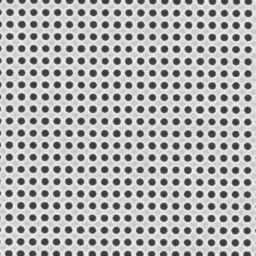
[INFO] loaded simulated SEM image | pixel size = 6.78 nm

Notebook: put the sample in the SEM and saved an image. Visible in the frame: a regular array of holes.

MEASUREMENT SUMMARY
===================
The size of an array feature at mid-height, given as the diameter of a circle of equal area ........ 53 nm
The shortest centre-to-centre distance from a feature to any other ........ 78.6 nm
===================